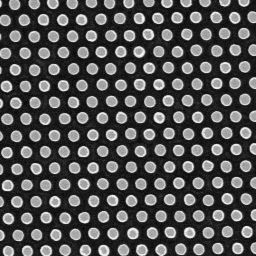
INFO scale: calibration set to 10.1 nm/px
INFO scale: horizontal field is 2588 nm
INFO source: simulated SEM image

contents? a regular array of raised bodies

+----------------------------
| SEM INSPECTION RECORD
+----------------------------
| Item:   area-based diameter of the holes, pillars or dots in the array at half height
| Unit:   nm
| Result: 108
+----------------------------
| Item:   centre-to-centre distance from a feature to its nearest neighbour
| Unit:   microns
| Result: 0.187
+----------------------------